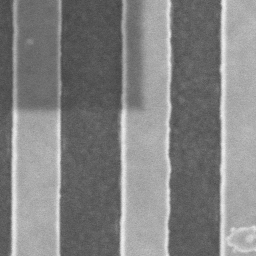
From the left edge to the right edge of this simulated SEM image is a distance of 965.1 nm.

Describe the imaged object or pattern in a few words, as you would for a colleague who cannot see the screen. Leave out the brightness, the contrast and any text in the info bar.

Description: lines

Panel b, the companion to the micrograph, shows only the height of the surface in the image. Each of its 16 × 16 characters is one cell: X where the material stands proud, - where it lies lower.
-XXX----XXX---XX
-XXX----XXX---XX
-XXX----XXX---XX
-XXX----XXX---XX
-XXX----XXX---XX
-XXX----XXX---XX
-XXX----XXX---XX
-XXX----XXX---XX
-XXX----XXX---XX
-XXX----XXX---XX
-XXX----XXX---XX
-XXX----XXX---XX
-XXX----XXX---XX
-XXX----XXX---XX
-XXX----XXX---XX
-XXX----XX----XX